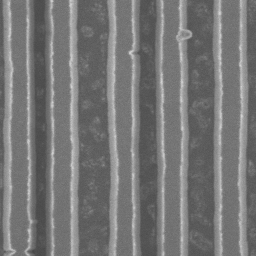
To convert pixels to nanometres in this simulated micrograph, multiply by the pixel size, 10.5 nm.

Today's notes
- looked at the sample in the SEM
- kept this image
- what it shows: parallel lines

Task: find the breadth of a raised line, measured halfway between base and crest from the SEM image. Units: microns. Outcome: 0.258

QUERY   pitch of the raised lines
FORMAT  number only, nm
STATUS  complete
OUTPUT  552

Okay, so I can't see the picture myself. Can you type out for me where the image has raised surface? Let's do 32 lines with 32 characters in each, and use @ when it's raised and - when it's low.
-@@@--@@@-----@@@---@@@----@@@--
-@@@--@@@-----@@@---@@@----@@@--
-@@@--@@@-----@@@---@@@----@@@--
-@@@--@@@-----@@@---@@@----@@@--
-@@@--@@@-----@@@---@@@@---@@@--
-@@@--@@@-----@@@---@@@----@@@--
-@@@--@@@-----@@@---@@@----@@@--
-@@@--@@@-----@@@---@@@----@@@--
-@@@--@@@-----@@@---@@@----@@@--
-@@@--@@@-----@@@---@@@----@@@--
-@@@--@@@-----@@@---@@@----@@@--
-@@@--@@@-----@@@---@@@----@@@--
-@@@--@@@-----@@@---@@@----@@@@-
-@@@--@@@-----@@@---@@@----@@@@-
-@@@--@@@-----@@@---@@@----@@@@-
-@@@--@@@-----@@@---@@@----@@@--
-@@@--@@@-----@@@---@@@----@@@--
-@@@--@@@-----@@@---@@@----@@@--
-@@@--@@@-----@@@---@@@----@@@--
-@@@--@@@-----@@@---@@@----@@@--
-@@@--@@@-----@@@---@@@----@@@--
-@@@--@@@-----@@@---@@@----@@@--
-@@@--@@@-----@@@---@@@----@@@--
-@@@--@@@-----@@@---@@@----@@@--
-@@@--@@@-----@@@---@@@----@@@--
-@@@--@@@-----@@@---@@@----@@@--
-@@@--@@@-----@@@---@@@----@@@--
-@@@--@@@-----@@@---@@@----@@@--
-@@@--@@@-----@@@---@@@----@@@--
-@@@--@@@-----@@@---@@@----@@@--
-@@@--@@@-----@@@---@@@----@@@--
-@@@--@@@-----@@@---@@@----@@@--